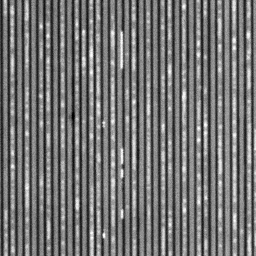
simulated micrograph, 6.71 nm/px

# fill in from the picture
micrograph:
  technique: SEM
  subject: parallel lines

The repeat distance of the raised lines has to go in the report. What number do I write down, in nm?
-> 48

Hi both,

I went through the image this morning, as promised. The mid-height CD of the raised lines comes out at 0.0285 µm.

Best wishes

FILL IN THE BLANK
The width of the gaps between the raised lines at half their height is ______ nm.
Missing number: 22.6